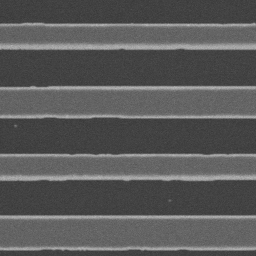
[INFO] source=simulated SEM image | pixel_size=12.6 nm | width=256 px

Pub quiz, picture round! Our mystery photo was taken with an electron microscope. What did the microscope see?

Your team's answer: lines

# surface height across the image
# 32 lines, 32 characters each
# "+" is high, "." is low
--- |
................................
................................
................................
++++++++++++++++++++++++++++++++
++++++++++++++++++++++++++++++++
++++++++++++++++++++++++++++++++
................................
................................
................................
................................
................................
++++++++++++++++++++++++++++++++
++++++++++++++++++++++++++++++++
++++++++++++++++++++++++++++++++
++++++++++++++++++++++++++++++++
................................
................................
................................
................................
++++++++++++++++++++++++++++++++
++++++++++++++++++++++++++++++++
++++++++++++++++++++++++++++++++
................................
................................
................................
................................
................................
++++++++++++++++++++++++++++++++
++++++++++++++++++++++++++++++++
++++++++++++++++++++++++++++++++
++++++++++++++++++++++++++++++++
................................